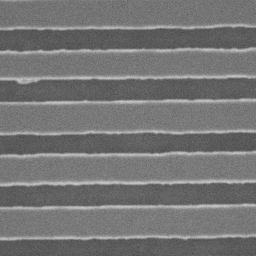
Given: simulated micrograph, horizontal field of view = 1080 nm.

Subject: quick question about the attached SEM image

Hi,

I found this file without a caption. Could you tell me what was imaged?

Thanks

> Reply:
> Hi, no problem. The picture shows lines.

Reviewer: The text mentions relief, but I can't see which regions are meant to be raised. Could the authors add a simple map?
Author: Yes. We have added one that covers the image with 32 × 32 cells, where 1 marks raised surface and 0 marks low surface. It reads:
11111111111111111111111111111111
11111111111111111111111111111111
11111111111111111111111111111111
11111111111111111111000110000000
00000000000000000000000000000000
00000000000000000000000000000000
11111111111111111111111111111111
11111111111111111111111111111111
11111111111111111111111111111111
11111111111111111111111111111111
00000000000000000000000000000000
00000000000000000000000000000000
00000000000000000000000000000010
11111111111111111111111111111111
11111111111111111111111111111111
11111111111111111111111111111111
11111111111111111101111111111000
00000000000000000000000000000000
00000000000000000000000000000000
11111111111111111111111111111111
11111111111111111111111111111111
11111111111111111111111111111111
11111111111111111111111111111111
00000000000000000000000000000000
00000000000000000000000000000000
00000000000000000000000000000000
11111111111111111111111111111111
11111111111111111111111111111111
11111111111111111111111111111111
11111111111111111111111111111111
00000000000000000000000000000000
00000000000000000000000000000000